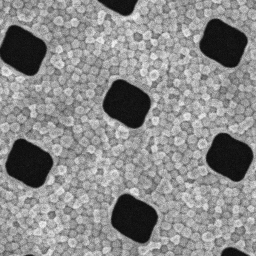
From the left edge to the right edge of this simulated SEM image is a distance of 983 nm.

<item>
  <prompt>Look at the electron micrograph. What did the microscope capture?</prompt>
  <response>holes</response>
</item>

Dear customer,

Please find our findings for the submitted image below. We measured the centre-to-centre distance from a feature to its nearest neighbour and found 437 nm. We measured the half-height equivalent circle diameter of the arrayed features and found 174 nm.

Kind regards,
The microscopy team